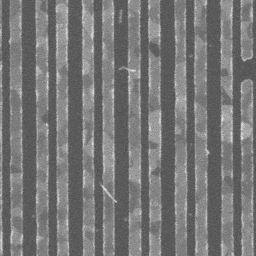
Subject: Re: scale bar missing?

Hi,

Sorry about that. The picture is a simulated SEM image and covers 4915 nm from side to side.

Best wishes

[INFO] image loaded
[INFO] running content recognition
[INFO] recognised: parallel lines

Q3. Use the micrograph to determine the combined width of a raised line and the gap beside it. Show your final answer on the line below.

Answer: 444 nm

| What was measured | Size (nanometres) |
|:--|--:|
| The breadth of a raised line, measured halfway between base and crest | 218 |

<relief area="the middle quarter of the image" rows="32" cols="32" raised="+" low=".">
+....++...++....+++..+++....++..
+....++...++....+++..+++....++..
+....++...++....+++..+++....++..
+....++...++....+++..+++....++..
+....++...++....+++..+++....++..
+....++...++....+++..+++....++..
+....++...++....+++..+++....++..
+....++...++....+++..+++....++..
+....++...++....+++..+++....++..
+....++...++....+++..+++....++..
+....++...++....+++..+++....++..
+....++...++....+++..+++....+++.
+....++...++....+++..+++....++..
+....++...++....+++..+++....++..
+....++...++....+++..+++....++..
+....++...++....+++..+++....+++.
+....++...++....+++..+++....+++.
+....++...++....+++..+++....++..
+....++...++....+++..+++....++..
+....++...++....+++..+++....+++.
+....++...++....+++..+++....+++.
+....++...++....+++..+++....+++.
+....++...++....+++..+++....+++.
+....++...+++...+++..+++....+++.
+....++...+++...+++..+++....+++.
+....++...+++...+++..+++....+++.
+....++...+++...+++..+++....++..
+....++...++....+++..+++....+++.
+....++...++....+++..+++....+++.
+....++...+++...+++...++....+++.
+....++...++....+++...++....+++.
+....++...++....+++...++....+++.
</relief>